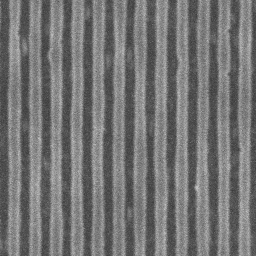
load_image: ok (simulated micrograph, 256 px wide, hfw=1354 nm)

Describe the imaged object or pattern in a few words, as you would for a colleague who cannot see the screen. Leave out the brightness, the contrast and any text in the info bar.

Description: parallel lines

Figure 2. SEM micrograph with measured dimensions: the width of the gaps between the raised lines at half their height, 58.8 nm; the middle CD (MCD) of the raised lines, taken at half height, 54.2 nanometres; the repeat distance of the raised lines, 111 nanometres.